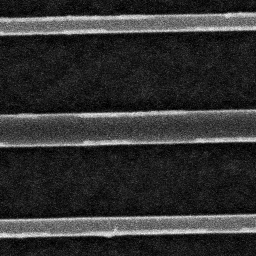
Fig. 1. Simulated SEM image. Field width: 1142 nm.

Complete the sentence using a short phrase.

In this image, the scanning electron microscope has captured one or a few lines or trenches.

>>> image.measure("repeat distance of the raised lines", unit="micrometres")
0.451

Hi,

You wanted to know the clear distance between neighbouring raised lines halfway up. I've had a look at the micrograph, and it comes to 0.34 um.